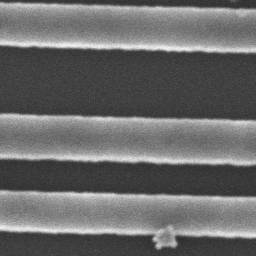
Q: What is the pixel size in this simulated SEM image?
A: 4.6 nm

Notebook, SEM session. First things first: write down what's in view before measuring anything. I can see lines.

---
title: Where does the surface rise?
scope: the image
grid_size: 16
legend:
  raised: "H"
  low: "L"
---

HHHHHHHHHHHHHLLL
HHHHHHHHHHHHHHHH
HHHHHHHHHHHHHHHH
LLLLLLLLLLLLLLLL
LLLLLLLLLLLLLLLL
LLLLLLLLLLLLLLLL
LLLLLLLLLLLLLLLL
HHHHHHHHHHHHHLLL
HHHHHHHHHHHHHHHH
HHHHHHHHHHHHHHHH
LLLLLLLLLLLLLLLL
LLLLLLLLLLLLLLLL
HHHHHHHHHHHHHHHH
HHHHHHHHHHHHHHHH
LLLHHHHHHHHHHHHH
LLLLLLLLLLLLLLLL